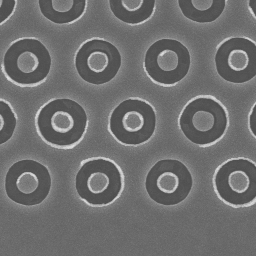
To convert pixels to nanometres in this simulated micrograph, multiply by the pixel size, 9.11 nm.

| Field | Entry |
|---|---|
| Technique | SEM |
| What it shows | a regular array of ring-shaped grooves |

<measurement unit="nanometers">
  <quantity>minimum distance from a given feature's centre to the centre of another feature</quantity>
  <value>635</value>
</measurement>